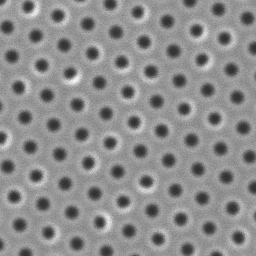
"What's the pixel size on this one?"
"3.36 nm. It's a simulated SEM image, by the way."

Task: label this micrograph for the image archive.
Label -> a regular array of holes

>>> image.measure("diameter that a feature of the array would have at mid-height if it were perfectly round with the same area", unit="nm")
48.4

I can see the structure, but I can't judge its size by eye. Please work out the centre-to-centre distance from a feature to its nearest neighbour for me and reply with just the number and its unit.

98.6 nm